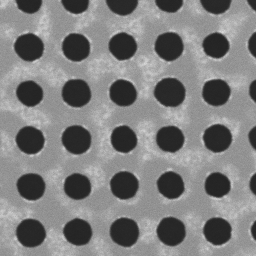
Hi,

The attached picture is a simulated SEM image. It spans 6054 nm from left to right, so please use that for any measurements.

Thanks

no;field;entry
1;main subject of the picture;a regular array of holes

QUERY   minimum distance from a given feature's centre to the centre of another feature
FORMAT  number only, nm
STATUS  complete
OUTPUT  1090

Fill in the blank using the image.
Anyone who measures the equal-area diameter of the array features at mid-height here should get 685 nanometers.